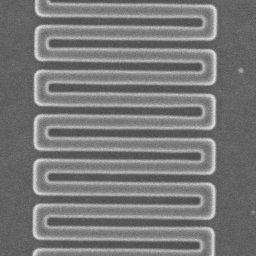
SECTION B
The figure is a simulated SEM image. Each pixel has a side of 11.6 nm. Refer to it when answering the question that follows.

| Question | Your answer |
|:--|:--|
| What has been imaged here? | groups of lines, slits or small figures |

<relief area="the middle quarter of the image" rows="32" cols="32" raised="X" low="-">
--------------------------------
--------------------------------
XXXXXXXXXXXXXXXXXXXXXXXXXXXXXXXX
XXXXXXXXXXXXXXXXXXXXXXXXXXXXXXXX
XXXXXXXXXXXXXXXXXXXXXXXXXXXXXXXX
--------------------------------
--------------------------------
XXXXXXXXXXX---------------------
XXXXXXXXXXXXXXXXXXXXXXXXXXXXXXXX
XXXXXXXXXXXXXXXXXXXXXXXXXXXXXXXX
--------------------------------
--------------------------------
--------------------------------
XXXXXXXXXXXXXXXXXXXXXXXXXXXXXXXX
XXXXXXXXXXXXXXXXXXXXXXXXXXXXXXXX
XXXXXXXXXXXXXXXXXXXXXXXXXXXXXXXX
--------------------------------
--------------------------------
--------------------------------
XXXXXXXXXXXXXXXXXXXXXXXXXXXXXXXX
XXXXXXXXXXXXXXXXXXXXXXXXXXXXXXXX
X--XXXXXXXXXXXXXXXXXXXXXXXXXXXXX
--------------------------------
--------------------------------
XXXXXXXXXXXXXXXXXXXXXXXXXXXXXXXX
XXXXXXXXXXXXXXXXXXXXXXXXXXXXXXXX
XXXXXXXXXXXXXXXXXXXXXXXXXXXXXXXX
--------------------------------
--------------------------------
--------------------------------
XXXXXXXXXXXXXXXXXXXXXXXXXXXXXXXX
XXXXXXXXXXXXXXXXXXXXXXXXXXXXXXXX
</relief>